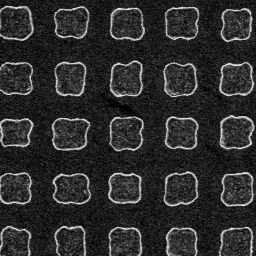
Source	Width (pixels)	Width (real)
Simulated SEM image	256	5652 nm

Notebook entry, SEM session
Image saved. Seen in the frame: a regular array of raised bodies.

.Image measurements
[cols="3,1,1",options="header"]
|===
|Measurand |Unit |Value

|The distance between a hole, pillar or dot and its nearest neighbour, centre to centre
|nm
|1200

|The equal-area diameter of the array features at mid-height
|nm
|761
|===